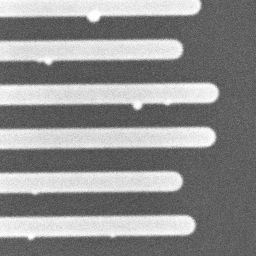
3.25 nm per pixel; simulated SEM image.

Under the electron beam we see groups of lines, slits or small figures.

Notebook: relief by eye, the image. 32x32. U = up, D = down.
UUUUUUUUUUUUUUUUUUUUUUUUUDDDDDDD
UUUUUUUUUUUUUUUUUUUUUUUUUDDDDDDD
DDDDDDDDDDDUDDDDDDDDDDDDDDDDDDDD
DDDDDDDDDDDDDDDDDDDDDDDDDDDDDDDD
DDDDDDDDDDDDDDDDDDDDDDDDDDDDDDDD
UUUUUUUUUUUUUUUUUUUUUUUDDDDDDDDD
UUUUUUUUUUUUUUUUUUUUUUUDDDDDDDDD
UUUUUUUUDDDDDDDDDDDDDDDDDDDDDDDD
DDDDDDDDDDDDDDDDDDDDDDDDDDDDDDDD
DDDDDDDDDDDDDDDDDDDDDDDDDDDDDDDD
DDDDDDDDDDDDDDDDDDDDDDUUUUDDDDDD
UUUUUUUUUUUUUUUUUUUUUUUUUUUDDDDD
UUUUUUUUUUUUUUUUUUUUUUUUUUUDDDDD
DDDDDDDDDDDDDDDDDDDDDDDDDDDDDDDD
DDDDDDDDDDDDDDDDDDDDDDDDDDDDDDDD
DDDDDDDDDDDDDDDDDDDDDDDDDDDDDDDD
UUUUUUUUUUUUUUUUUUUUUUUUUUUDDDDD
UUUUUUUUUUUUUUUUUUUUUUUUUUUDDDDD
UUUDDDDDDDDDDDDDDDDDDDDDDDDDDDDD
DDDDDDDDDDDDDDDDDDDDDDDDDDDDDDDD
DDDDDDDDDDDDDDDDDDDDDDDDDDDDDDDD
DDDDDDDDDDDDDDDDDDDDDDDDDDDDDDDD
UUUUUUUUUUUUUUUUUUUUUUUDDDDDDDDD
UUUUUUUUUUUUUUUUUUUUUUDDDDDDDDDD
DDDDDDDDDDDDDDDDDDDDDDDDDDDDDDDD
DDDDDDDDDDDDDDDDDDDDDDDDDDDDDDDD
DDDDDDDDDDDDDDDDDDDDDDDDDDDDDDDD
UUUUUUUUUUUUUUUUUUUUUUUUDDDDDDDD
UUUUUUUUUUUUUUUUUUUUUUUUDDDDDDDD
UUUUUUUUDDDDDDUDDDDDDDDDDDDDDDDD
DDDDDDDDDDDDDDDDDDDDDDDDDDDDDDDD
DDDDDDDDDDDDDDDDDDDDDDDDDDDDDDDD